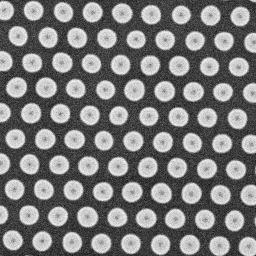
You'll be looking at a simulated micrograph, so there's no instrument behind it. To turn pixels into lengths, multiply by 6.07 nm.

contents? an array of small figures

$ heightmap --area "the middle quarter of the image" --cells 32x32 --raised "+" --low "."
++...++++...++++...+++++..+++++.
+....++++...++++....+++....++++.
..............+......+.....+++..
................................
.+++.....++.....+++......+......
.++++...++++....++++...++++....+
.++++...+++++..+++++...+++++..++
.++++....+++...+++++...++++...++
..........+.....+++.....+++....+
................................
................................
+....+++....+++.....+++....+++..
+...+++++...++++...++++...+++++.
+...+++++...++++...++++...+++++.
.....+++....+++....++++....++++.
................................
................................
.++++...+++.....+++.....++.....+
+++++...++++...+++++...++++...++
+++++...++++...+++++...++++...++
.+++....++++...++++....++++...++
................++.....+++.....+
................................
.....++......+..................
+...++++....++++...++++...++++..
+...++++...+++++...++++...+++++.
+...++++...+++++...++++...+++++.
.....++.....+++....++++....+++..
................................
.++.............................
++++....++++...++++....+++....++
+++++..+++++...++++...+++++...++